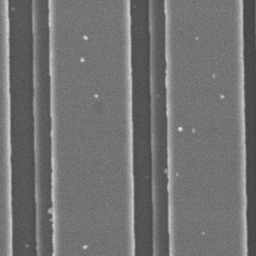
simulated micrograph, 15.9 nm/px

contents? lines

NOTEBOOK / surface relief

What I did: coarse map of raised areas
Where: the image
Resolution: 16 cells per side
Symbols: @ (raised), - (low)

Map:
---@@@@@--@@@@@-
@--@@@@@--@@@@@-
@--@@@@@--@@@@@-
@--@@@@@--@@@@@-
@--@@@@@--@@@@@-
@--@@@@@--@@@@@-
@--@@@@@--@@@@@-
@--@@@@@--@@@@@-
@--@@@@@---@@@@-
@--@@@@@---@@@@-
@--@@@@@---@@@@-
@--@@@@@---@@@@-
@--@@@@@---@@@@-
@--@@@@@---@@@@-
@--@@@@@---@@@@-
@--@@@@@---@@@@-